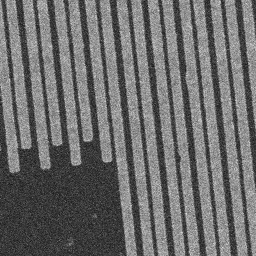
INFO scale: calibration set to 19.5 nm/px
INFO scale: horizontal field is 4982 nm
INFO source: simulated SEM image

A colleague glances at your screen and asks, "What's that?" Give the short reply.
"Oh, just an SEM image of parallel lines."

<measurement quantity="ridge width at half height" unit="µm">0.179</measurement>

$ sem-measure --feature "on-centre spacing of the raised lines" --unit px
15.6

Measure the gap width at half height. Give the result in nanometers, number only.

118